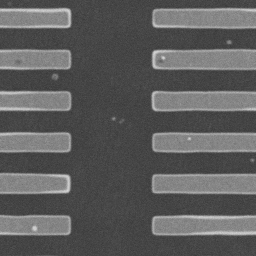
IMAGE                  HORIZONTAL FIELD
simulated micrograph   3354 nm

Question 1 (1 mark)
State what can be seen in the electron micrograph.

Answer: groups of lines, slits or small figures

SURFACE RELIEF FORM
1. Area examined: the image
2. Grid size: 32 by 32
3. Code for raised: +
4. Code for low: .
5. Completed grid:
................................
++++++++...........+++++++++++++
+++++++++..........+++++++++++++
................................
................................
................................
++++++++............++++++++++++
+++++++++..........+++++++++++++
..++++++............++++++++++++
................................
................................
................................
+++++++++..........+++++++++++++
+++++++++..........+++++++++++++
................................
................................
................................
+++++++++..........+++++++++++++
+++++++++..........+++++++++++++
................................
................................
................................
+++++++++..........+++++++++++++
+++++++++..........+++++++++++++
................................
................................
................................
+++++++++..........+++++++++++++
+++++++++..........+++++++++++++
................................
................................
................................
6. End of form